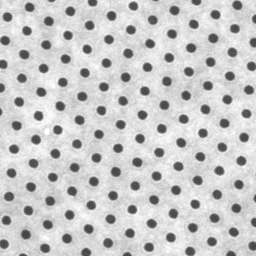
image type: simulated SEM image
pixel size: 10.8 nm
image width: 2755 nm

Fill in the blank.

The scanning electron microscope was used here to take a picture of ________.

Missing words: a regular array of holes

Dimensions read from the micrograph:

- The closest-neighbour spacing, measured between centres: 0.254 micrometres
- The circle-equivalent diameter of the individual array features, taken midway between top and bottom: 116 nm